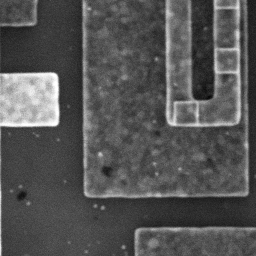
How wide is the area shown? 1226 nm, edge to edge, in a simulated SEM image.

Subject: wiring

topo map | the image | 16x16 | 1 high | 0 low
0000000000110110
0000000000110110
0000000000110110
0000000000110110
0000000000110110
0000000000110110
0000000000111110
0000000000011110
0000000000000000
0000000000000000
0000000000000000
0000000000000000
0000000000000000
0000000000000000
0000000000000000
0000000000000000